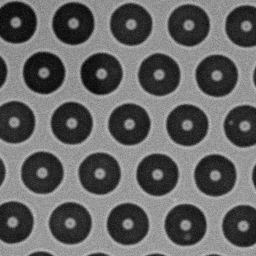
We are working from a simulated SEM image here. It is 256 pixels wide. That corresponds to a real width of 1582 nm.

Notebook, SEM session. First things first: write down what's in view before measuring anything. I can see an array of small figures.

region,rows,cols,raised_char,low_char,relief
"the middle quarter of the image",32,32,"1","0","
11110000000000111110000000000111
11110000000000011100000000000111
01110000010000011100000110000111
11110000000000011100000000000111
11110000000000111110000000000111
11111000000000111110000000000111
11111100000001111111000000001111
11111110000011111111100000011111
11111111111111111111111111111111
00011111111111111111111111111111
00000111111110000001111111110000
00000011111100000000111111100000
00000001111000000000011111000000
00000001111000000000001111000000
01100001111000001000001110000000
00100001111000001000001110000011
00000001111000000000001110000000
00000001111000000000011111000000
00000011111100000000011111000000
00000111111110000000111111100000
10111111111111100111111111111000
11111111111111111111111111111111
11111110000111111111110001111111
11111000000001111111000000011111
11110000000000111110000000001111
11110000000000111100000000001111
11100000000000111100000000000111
11100000110000111100000100000111
11110000000000111100000000000111
11110000000000111100000000000111
11110000000000111110000000001111
11111000000001111110000000001111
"